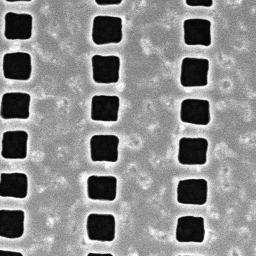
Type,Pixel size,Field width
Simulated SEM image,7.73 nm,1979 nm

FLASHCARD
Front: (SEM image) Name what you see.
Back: a regular array of holes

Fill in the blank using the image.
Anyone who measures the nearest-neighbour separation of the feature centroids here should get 306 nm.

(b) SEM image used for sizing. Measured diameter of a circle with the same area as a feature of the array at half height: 0.232 microns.